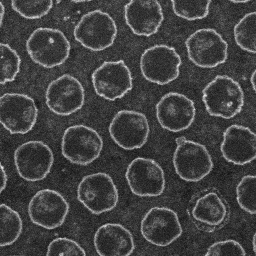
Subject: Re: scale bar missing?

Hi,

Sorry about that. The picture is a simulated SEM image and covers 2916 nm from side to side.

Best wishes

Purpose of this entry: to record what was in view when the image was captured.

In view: a regular array of raised bodies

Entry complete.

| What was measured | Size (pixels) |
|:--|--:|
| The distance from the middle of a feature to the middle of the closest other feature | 50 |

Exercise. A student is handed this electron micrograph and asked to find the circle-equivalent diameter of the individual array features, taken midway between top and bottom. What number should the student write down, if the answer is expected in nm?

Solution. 430